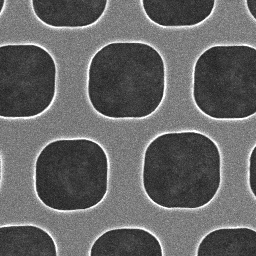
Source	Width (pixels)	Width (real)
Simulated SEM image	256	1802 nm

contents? holes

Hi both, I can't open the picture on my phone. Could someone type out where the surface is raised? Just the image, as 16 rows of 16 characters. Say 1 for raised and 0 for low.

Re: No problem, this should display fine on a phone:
1100000110000111
1110001111001111
1111111111111111
0001110000111000
0001110000110000
0001110000110000
0001110000110000
1111111111111111
1111111111000111
1110001110000011
1100000110000011
1100000110000011
1110001111000111
1111111111111111
0001111001111000
0001110000110000